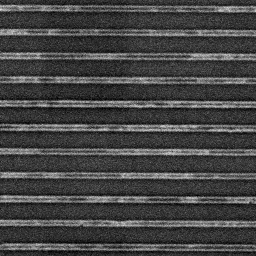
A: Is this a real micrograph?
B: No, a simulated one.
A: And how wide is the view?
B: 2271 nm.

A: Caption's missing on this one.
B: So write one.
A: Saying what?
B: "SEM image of parallel lines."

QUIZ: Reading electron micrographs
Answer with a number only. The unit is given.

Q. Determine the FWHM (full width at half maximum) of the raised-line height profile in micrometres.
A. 0.0488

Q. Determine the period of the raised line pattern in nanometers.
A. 212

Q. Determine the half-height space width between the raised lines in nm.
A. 163